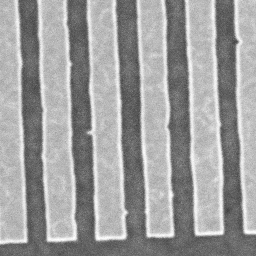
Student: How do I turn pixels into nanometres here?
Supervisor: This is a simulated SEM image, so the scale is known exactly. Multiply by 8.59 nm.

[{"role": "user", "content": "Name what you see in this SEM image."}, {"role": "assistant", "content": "parallel lines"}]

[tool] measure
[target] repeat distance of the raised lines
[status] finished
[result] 423 nanometres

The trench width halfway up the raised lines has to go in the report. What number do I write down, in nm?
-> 194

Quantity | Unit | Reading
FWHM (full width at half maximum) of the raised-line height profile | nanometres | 224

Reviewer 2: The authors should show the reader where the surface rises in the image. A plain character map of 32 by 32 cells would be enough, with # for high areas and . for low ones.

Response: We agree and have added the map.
##...###...###...###...####...##
##...###...###...####..####...##
##...###...###...####..####...##
##...###...###...####..####...##
##...###...###...####..####...##
##...###...###....###...###...##
##...###...####...###...###...##
###..####..####...###...###...##
###..####..####...###...###...##
##...####..####...###...###...##
##...####..####...###...###...##
###..####..####...###...###...##
###..####..####...###...###...##
###...###...###...###...###...##
###..####...###...###...###...##
###..####...###...###...###...##
###...###..####...###...###...##
###..####...###...###...###...##
###...###...###...###...###...##
###..####...###...###...####..##
###...###...###...###...####..##
###...###...###...###...####..##
###...###...###...###...####..##
###...###...###...###...####..##
###...###...###...###...####..##
###...###...###...###...####...#
###...###...####..###...####...#
###...###...###...###...####...#
###...###...####..####...###...#
###...###...###.................
................................
................................